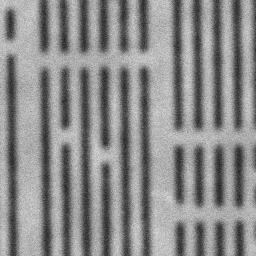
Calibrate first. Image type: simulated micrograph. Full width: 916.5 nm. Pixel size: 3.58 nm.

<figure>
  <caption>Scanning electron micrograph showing groups of lines, slits or small figures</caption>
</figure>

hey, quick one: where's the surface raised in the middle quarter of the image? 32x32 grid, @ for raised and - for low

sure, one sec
@@@@@@@@@@@@@@@@@@@@@@@@@@@--@@@
-@@@--@@@--@@@--@@@--@@@@@@--@@@
-@@@--@@@--@@@--@@@--@@@@@@--@@@
-@@@--@@@--@@@--@@@--@@@@@@--@@@
-@@@--@@@--@@@--@@@--@@@@@@---@@
-@@@--@@@--@@@--@@@--@@@@@@@-@@@
-@@@--@@@--@@@--@@@--@@@@@@@-@@@
-@@@--@@@--@@@--@@@--@@@@@@@--@@
--@@--@@@--@@@--@@@--@@@@@@@--@@
-@@@--@@@--@@@--@@@--@@@@@@@--@@
-@@@--@@@--@@@--@@@--@@@@@@@--@@
--@@--@@@--@@@--@@@--@@@@@@@--@@
--@@--@@@--@@@--@@@--@@@@@@@--@@
--@@--@@@--@@@--@@@--@@@@@@@--@@
--@@--@@@--@@@--@@@--@@@@@@@--@@
--@@--@@@--@@@--@@@--@@@@@@@--@@
-@@@--@@@--@@@--@@@--@@@@@@@-@@@
@@@@--@@@--@@@--@@@--@@@@@@@@@@@
@@@@--@@@---@@--@@@--@@@@@@@@@@@
@@@@--@@@---@@--@@@--@@@@@@@@@@@
-@@@--@@@--@@@--@@@--@@@@@@@-@@@
--@@--@@@@@@@@--@@@--@@@@@@@--@@
--@@--@@@@@@@@--@@@---@@@@@@--@@
--@@--@@@@@@@@--@@@---@@@@@@--@@
--@@--@@@@@@@@--@@@---@@@@@@--@@
--@@---@@---@@--@@@---@@@@@@--@@
--@@@-@@@---@@--@@@--@@@@@@@--@@
--@@@-@@@---@@---@@--@@@@@@@--@@
--@@--@@@---@@---@@--@@@@@@@--@@
--@@@-@@@---@@--@@@---@@@@@@--@@
--@@@--@@---@@--@@@---@@@@@@--@@
--@@@--@@---@@--@@@---@@@@@@--@@